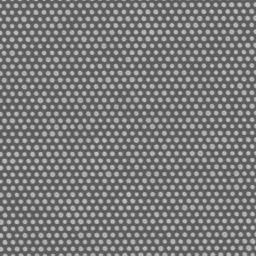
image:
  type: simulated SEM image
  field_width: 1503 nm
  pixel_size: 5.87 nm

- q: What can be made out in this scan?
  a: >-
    a regular array of raised bodies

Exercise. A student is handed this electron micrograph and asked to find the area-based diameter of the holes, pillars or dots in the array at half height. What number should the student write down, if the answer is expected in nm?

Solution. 24.8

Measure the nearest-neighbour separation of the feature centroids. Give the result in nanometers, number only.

44.7